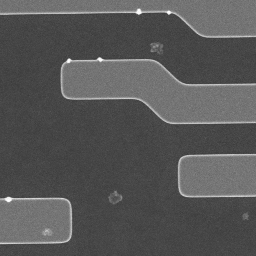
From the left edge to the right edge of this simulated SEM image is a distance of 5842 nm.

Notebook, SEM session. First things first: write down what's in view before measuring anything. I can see groups of lines, slits or small figures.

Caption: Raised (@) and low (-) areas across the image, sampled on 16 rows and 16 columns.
@@@@@@@@@@@@@@@@
------------@@@@
----------------
----------------
----@@@@@@@-----
----@@@@@@@@@@@@
---------@@@@@@@
----------@@@@@@
----------------
----------------
-----------@@@@@
-----------@@@@@
@@@@------------
@@@@------------
@@@@------------
----------------